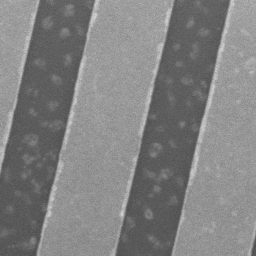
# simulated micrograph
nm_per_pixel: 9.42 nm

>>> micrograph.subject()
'one or a few lines or trenches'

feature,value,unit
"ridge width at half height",710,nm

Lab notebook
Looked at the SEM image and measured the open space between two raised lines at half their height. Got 0.526 microns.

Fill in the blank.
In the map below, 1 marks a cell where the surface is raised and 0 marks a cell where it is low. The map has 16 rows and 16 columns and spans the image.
1100001111100011
1100001111100011
1100011111000011
1100011111000011
1000011111000111
1000011111000111
1000011110000111
1000111110000111
1000111110001111
0000111110001111
0000111100001111
0001111100001111
0001111100001111
0001111100011111
0001111000011111
0011111000011111